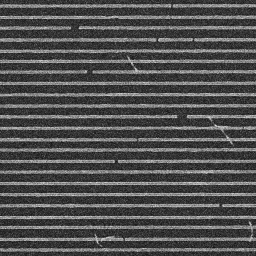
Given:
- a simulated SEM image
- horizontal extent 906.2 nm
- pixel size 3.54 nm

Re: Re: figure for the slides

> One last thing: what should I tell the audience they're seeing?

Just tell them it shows parallel lines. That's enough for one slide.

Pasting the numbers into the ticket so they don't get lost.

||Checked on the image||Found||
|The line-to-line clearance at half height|30.5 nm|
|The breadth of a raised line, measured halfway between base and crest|0.0093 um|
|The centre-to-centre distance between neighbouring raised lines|39.2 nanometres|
